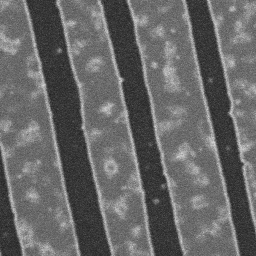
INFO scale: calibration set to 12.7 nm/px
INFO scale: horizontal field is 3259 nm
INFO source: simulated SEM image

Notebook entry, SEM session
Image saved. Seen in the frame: one or a few lines or trenches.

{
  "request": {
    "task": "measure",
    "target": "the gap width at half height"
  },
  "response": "0.347 um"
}